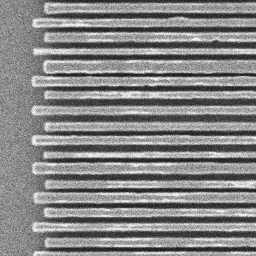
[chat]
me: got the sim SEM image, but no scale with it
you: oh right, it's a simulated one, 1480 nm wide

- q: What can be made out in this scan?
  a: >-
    parallel lines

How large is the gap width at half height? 28.2 nanometres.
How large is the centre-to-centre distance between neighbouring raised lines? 84.6 nm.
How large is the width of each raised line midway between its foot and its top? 9.62 px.